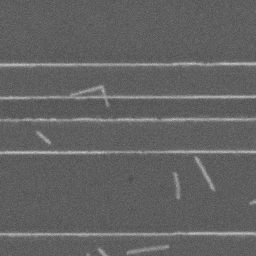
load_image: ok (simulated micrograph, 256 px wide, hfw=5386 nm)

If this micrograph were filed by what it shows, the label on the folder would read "lines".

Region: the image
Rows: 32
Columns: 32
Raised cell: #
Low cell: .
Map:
................................
................................
................................
................................
................................
................................
................................
................................
################################
################################
################################
################################
................................
................................
................................
################################
################################
################################
################################
................................
................................
................................
................................
................................
................................
................................
................................
................................
................................
################################
################################
################################